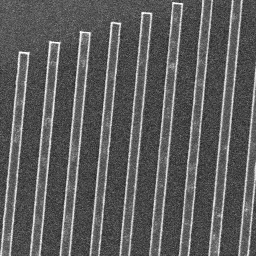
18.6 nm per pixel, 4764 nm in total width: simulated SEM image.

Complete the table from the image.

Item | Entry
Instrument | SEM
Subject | parallel lines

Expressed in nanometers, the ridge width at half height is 174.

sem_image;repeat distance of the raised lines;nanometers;552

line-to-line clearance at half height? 380 nm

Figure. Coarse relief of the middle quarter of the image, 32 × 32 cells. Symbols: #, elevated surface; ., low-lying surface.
....##.....##.....###.....##....
...###.....##.....###.....##....
...###.....##.....##......##....
...##......##.....##......##....
...##......##.....##......##....
...##......##.....##.....###....
...##.....###.....##.....###....
...##.....##......##.....##.....
...##.....##......##.....##.....
...##.....##......##.....##.....
...##.....##......##.....##.....
...##.....##.....###.....##.....
..###.....##.....###.....##.....
..##......##.....##......##.....
..##......##.....##......##.....
..##......##.....##......##.....
..##......##.....##.....###.....
..##.....###.....##.....###.....
..##.....##......##.....##......
..##.....##......##.....##.....#
..##.....##......##.....##.....#
..##.....##......##.....##.....#
.###.....##.....###.....##.....#
.###.....##.....###.....##.....#
.##......##.....##......##.....#
.##......##.....##......##.....#
.##......##.....##......##.....#
.##.....###.....##.....###.....#
.##.....###.....##.....###.....#
.##.....##......##.....##......#
.##.....##......##.....##.....##
.##.....##......##.....##.....##